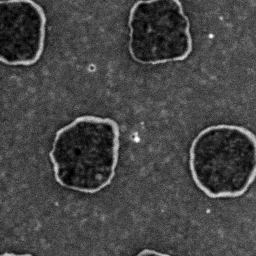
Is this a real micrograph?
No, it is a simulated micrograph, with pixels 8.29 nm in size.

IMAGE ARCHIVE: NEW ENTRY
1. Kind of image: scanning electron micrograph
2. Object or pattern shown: raised bodies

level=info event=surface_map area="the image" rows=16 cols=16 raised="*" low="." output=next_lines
**......***.....
***.....****....
***.....****....
**......***.....
................
................
................
.....*..........
....***.....****
...****.....****
...****.....****
....***.....****
................
................
................
................